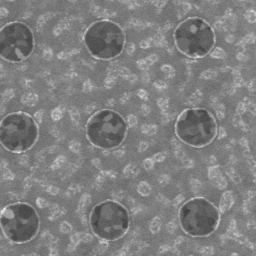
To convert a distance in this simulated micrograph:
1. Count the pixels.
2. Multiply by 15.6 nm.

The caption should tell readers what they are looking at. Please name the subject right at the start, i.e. raised bodies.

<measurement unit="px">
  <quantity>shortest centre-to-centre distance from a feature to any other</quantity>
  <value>89.7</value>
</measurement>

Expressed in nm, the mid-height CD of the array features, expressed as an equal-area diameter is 620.